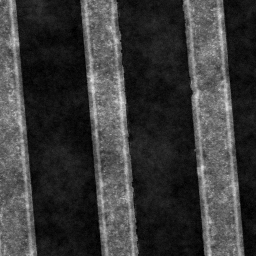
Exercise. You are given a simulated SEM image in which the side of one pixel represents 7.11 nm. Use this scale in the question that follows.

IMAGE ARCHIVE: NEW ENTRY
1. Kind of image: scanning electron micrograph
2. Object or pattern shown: one or a few lines or trenches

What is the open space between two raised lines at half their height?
536 nm